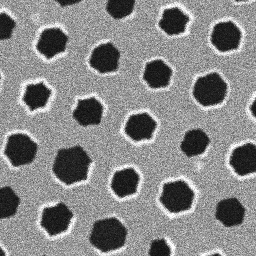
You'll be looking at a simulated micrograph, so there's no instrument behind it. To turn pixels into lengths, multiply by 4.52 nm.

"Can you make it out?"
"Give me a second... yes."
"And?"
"a regular array of holes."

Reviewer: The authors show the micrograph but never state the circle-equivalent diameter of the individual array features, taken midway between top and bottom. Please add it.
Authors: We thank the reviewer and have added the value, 0.135 um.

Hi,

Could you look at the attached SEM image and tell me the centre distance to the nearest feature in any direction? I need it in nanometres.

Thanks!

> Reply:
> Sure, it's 246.